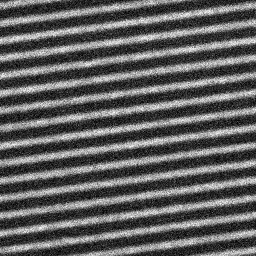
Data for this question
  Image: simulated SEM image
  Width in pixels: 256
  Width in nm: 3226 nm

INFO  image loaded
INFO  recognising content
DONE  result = parallel lines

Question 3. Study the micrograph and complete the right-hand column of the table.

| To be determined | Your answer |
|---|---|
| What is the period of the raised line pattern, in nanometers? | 218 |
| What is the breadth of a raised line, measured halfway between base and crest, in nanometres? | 65.5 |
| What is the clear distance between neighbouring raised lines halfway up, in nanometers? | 151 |